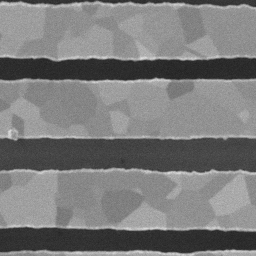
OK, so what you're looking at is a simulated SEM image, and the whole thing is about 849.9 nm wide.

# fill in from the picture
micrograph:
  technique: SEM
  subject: lines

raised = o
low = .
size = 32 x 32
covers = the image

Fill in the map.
oooooo..ooooooooooooooo.........
oooooooooooooooooooooooooooooooo
oooooooooooooooooooooooooooooooo
oooooooooooooooooooooooooooooooo
oooooooooooooooooooooooooooooooo
oooooooooooooooooooooooooooooooo
oooooooooooooooooooooooooooooooo
......ooo......ooooo..oooo......
................................
................................
oooooooooooooooooooooooooooooooo
oooooooooooooooooooooooooooooooo
oooooooooooooooooooooooooooooooo
oooooooooooooooooooooooooooooooo
oooooooooooooooooooooooooooooooo
oooooooooooooooooooooooooooooooo
oooooooooooooooooooooooooooooooo
................................
................................
................................
................................
oooooooooooooooooooo.oo.o.ooooo.
oooooooooooooooooooooooooooooooo
oooooooooooooooooooooooooooooooo
oooooooooooooooooooooooooooooooo
oooooooooooooooooooooooooooooooo
oooooooooooooooooooooooooooooooo
oooooooooooooooooooooooooooooooo
oo..oo.ooooooooooooooooooooooooo
................................
................................
.ooooooooooooooooooo....oooooooo